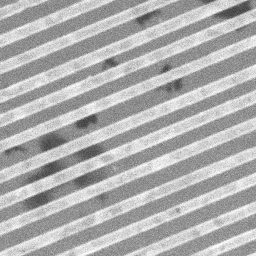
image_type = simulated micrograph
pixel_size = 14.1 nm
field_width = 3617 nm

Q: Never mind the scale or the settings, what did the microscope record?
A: parallel lines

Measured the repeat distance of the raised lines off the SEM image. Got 354 nanometers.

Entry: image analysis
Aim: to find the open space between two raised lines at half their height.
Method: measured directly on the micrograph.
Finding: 0.204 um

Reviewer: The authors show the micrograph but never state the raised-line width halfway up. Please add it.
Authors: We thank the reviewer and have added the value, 0.143 µm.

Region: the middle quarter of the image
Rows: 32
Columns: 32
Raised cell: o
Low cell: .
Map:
oooooo........oooooo..........oo
oooo.......ooooooo.........ooooo
o........ooo.ooo.........oooooo.
......oooooo..........oooooo....
....ooooooo.........oooooo......
..oooooo.........ooooooo........
oooooo.........oooooo...........
oooo.........o.oooo.............
o.........oooooo............oooo
........oooooo............oooooo
.....oooooo............ooooooo..
...oooooo............ooooooo....
.oooooo...........ooooo.........
ooooo...........ooooooo........o
oo............oooooo.........ooo
...........ooooooo.........ooooo
.........ooooooo........ooooooo.
......oooo.oo.........ooooooo...
....oooooo.........oooooooo.....
..oooooo.........ooooooo........
ooooo............ooooo.........o
oooo........ooooooo..........o.o
o.........ooooooo.........oooooo
.......oooooooo.........ooooooo.
.....ooooooo.........ooooooo....
...ooooooo.........oooooo.......
ooooooo..........oooooo.........
ooooo.........ooooooo..........o
oo..........oooooo...........ooo
.........ooooooo...........ooooo
.......oooooo...........oo.oo...
.....oooooo...........oooooo....